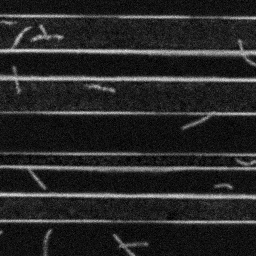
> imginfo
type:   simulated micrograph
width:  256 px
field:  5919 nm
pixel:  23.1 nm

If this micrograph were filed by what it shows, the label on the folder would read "lines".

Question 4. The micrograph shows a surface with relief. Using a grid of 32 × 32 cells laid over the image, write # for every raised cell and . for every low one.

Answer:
################################
################################
................................
................................
................................
................................
############....................
################################
################################
################################
................................
................................
................................
................................
################################
################################
################################
################################
################################
................................
................................
################################
################################
################################
..........................##.###
................................
................................
................................
################################
################################
################################
################################